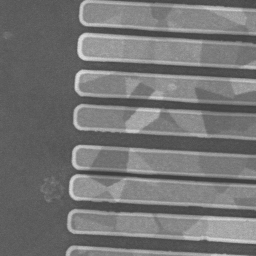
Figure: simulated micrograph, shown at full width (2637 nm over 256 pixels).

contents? parallel lines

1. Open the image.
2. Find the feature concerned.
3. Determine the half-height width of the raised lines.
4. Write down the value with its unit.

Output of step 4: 0.247 µm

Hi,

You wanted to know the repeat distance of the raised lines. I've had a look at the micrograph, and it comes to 358 nm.